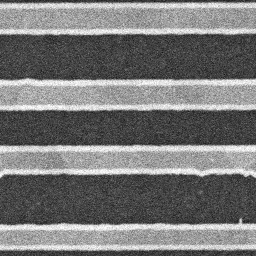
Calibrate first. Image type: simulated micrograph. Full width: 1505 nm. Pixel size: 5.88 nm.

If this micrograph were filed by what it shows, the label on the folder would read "one or a few lines or trenches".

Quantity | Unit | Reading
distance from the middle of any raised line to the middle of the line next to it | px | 72.9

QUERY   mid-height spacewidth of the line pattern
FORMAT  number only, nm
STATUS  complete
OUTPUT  294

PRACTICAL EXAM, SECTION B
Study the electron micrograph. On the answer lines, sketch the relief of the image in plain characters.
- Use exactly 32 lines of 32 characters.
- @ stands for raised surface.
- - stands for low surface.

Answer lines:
--------------------------------
@@@@@@@@@@@@@@@@@@@@@@@@@@@@@@@@
@@@@@@@@@@@@@@@@@@@@@@@@@@@@@@@@
@@@@@@@@@@@@@@@@@@@@@@@@@@@@@@@@
--------------------------------
--------------------------------
--------------------------------
--------------------------------
--------------------------------
--------------------------------
@@@@@@@@@@@@@@@@@@@@@@@@@@@@@@@@
@@@@@@@@@@@@@@@@@@@@@@@@@@@@@@@@
@@@@@@@@@@@@@@@@@@@@@@@@@@@@@@@@
--------@@-----------@--------@-
--------------------------------
--------------------------------
--------------------------------
--------------------------------
-------@@@------@@@@--@@-@@@----
@@@@@@@@@@@@@@@@@@@@@@@@@@@@@@@@
@@@@@@@@@@@@@@@@@@@@@@@@@@@@@@@@
@@@---------------------@@@---@@
--------------------------------
--------------------------------
--------------------------------
--------------------------------
--------------------------------
--------------------------------
@@@@@@@@@@@@@@@@@@@@@@@@@@@@@@@@
@@@@@@@@@@@@@@@@@@@@@@@@@@@@@@@@
@@@@@@@@@@@@@@@@@@@@@@@@@@@@@@@@
--------------------------------